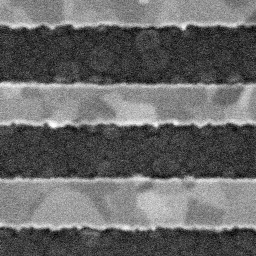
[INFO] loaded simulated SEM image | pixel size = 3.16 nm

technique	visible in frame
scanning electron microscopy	lines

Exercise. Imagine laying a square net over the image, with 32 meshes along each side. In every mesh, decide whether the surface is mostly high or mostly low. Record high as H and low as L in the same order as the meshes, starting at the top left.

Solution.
HHHHHHHHHHHHHHHHHHHHHHHHHHHHHHHH
HHHHHHHHHHHHHHHHHHHHHHHHHHHHHHHH
HHHHHHHHHHHHHHHHHHHHHHHHHHHHHHHH
LLLLLLLLLLLLLLLLLLLLLLLLLLLLLLLL
LLLLLLLLLLLLLLLLLLLLLLLLLLLLLLLL
LLLLLLLLLLLLLLLLLLLLLLLLLLLLLLLL
LLLLLLLLLLLLLLLLLLLLLLLLLLLLLLLL
LLLLLLLLLLLLLLLLLLLLLLLLLLLLLLLL
LLLLLLLLLLLLLLLLLLLLLLLLLLLLLLLL
LLLLLLLLLLLLLLLLLLLLLLLLLLLLLLLL
HLHLLLLLLHLLLLLLLLLLLLLLLLLLLLLL
HHHHHHHHHHHHHHHHHHHHHHHHHHHHHHHH
HHHHHHHHHHHHHHHHHHHHHHHHHHHHHHHH
HHHHHHHHHHHHHHHHHHHHHHHHHHHHHHHH
HHHHHHHHHHHHHHHHHHHHHHHHHHHHHHHH
HLLLHLHHLHLHLLLHLHLLLLHLHHLLLLLL
LLLLLLLLLLLLLLLLLLLLLLLLLLLLLLLL
LLLLLLLLLLLLLLLLLLLLLLLLLLLLLLLL
LLLLLLLLLLLLLLLLLLLLLLLLLLLLLLLL
LLLLLLLLLLLLLLLLLLLLLLLLLLLLLLLL
LLLLLLLLLLLLLLLLLLLLLLLLLLLLLLLL
LLLLLLLLLLLLLLLLLLLLLLLLLLLLLLLL
HLHHHHHHHHHHHHHHHHHHLHHHHHHHHHHH
HHHHHHHHHHHHHHHHHHHHHHHHHHHHHHHH
HHHHHHHHHHHHHHHHHHHHHHHHHHHHHHHH
HHHHHHHHHHHHHHHHHHHHHHHHHHHHHHHH
HHHHHHHHHHHHHHHHHHHHHHHHHHHHHHHH
HHHHHHHHHHHHHHHHHHHHHHHHHHHHHHHH
LLHLLLHHLLLLHLLHHHHLLHLHLHHHLLLL
LLLLLLLLLLLLLLLLLLLLLLLLLLLLLLLL
LLLLLLLLLLLLLLLLLLLLLLLLLLLLLLLL
LLLLLLLLLLLLLLLLLLLLLLLLLLLLLLLL